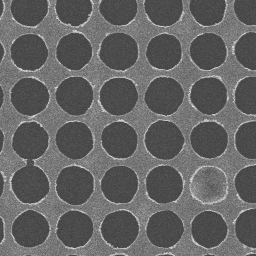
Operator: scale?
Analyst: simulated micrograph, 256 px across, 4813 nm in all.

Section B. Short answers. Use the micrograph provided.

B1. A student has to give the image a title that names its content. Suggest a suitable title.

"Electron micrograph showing a regular array of holes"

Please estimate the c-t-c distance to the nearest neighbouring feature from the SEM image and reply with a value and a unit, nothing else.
830 nm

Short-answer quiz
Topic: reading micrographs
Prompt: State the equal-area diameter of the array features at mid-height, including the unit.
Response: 706 nanometers